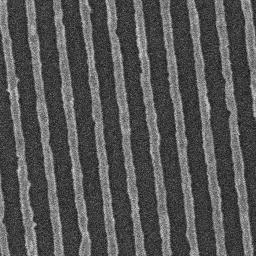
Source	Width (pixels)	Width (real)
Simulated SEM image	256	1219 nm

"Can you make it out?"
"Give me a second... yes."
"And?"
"parallel lines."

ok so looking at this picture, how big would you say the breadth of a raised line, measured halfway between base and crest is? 42.5 nm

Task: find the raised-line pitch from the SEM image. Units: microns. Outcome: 0.128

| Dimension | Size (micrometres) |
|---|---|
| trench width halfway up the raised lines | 0.0857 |